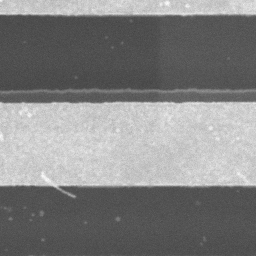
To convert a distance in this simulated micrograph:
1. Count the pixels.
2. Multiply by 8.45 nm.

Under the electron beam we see lines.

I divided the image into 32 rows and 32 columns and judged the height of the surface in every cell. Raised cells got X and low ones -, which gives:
XXXXXXXXXXXXXXXXXXXXXXXXXXXXXXXX
XXXXXXXXXXXXXXXXXXXXXXXXXXXXXXXX
--------------------------------
--------------------------------
--------------------------------
--------------------------------
--------------------------------
--------------------------------
--------------------------------
--------------------------------
--------------------------------
--------------------------------
--------------------------------
XXXXXXXXXXXXXXXXXXXXXXXXXXXXXXXX
XXXXXXXXXXXXXXXXXXXXXXXXXXXXXXXX
XXXXXXXXXXXXXXXXXXXXXXXXXXXXXXXX
XXXXXXXXXXXXXXXXXXXXXXXXXXXXXXXX
XXXXXXXXXXXXXXXXXXXXXXXXXXXXXXXX
XXXXXXXXXXXXXXXXXXXXXXXXXXXXXXXX
XXXXXXXXXXXXXXXXXXXXXXXXXXXXXXXX
XXXXXXXXXXXXXXXXXXXXXXXXXXXXXXXX
XXXXXXXXXXXXXXXXXXXXXXXXXXXXXXXX
XXXXXXXXXXXXXXXXXXXXXXXXXXXXXXXX
--------------------------------
--------------------------------
--------------------------------
--------------------------------
--------------------------------
--------------------------------
--------------------------------
--------------------------------
--------------------------------